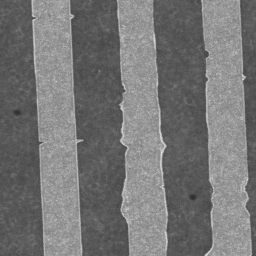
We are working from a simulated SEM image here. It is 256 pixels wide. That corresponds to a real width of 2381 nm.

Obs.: one or a few lines or trenches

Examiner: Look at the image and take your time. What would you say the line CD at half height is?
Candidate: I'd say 344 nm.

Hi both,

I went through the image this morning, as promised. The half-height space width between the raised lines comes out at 442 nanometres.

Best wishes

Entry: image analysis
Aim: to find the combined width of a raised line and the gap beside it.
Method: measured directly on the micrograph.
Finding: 787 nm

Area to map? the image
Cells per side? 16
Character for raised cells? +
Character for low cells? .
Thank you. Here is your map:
..++...+++...++.
..++...+++...++.
..++....++...++.
..++....++...++.
..+++...++...++.
..+++...++...++.
..+++...++...++.
..+++...++...++.
..+++...++...++.
...++...++...++.
...++...++...++.
...++...++...++.
...++...++...++.
...++...++...+++
...++...++...+++
...++...++...+++